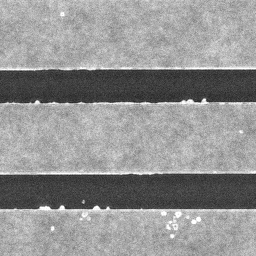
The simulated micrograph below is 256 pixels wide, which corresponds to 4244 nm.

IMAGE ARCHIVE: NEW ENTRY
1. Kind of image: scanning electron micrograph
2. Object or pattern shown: lines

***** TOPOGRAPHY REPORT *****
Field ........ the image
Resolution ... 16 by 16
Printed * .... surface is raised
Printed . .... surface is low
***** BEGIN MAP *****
****************
****************
****************
****************
................
................
**.*************
****************
****************
****************
****************
................
................
****************
****************
****************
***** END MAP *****